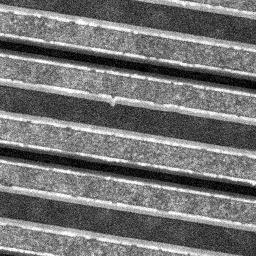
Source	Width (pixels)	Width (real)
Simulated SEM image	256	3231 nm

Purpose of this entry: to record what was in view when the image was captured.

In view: parallel lines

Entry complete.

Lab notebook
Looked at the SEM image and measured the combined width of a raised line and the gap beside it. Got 633 nm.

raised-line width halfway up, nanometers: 366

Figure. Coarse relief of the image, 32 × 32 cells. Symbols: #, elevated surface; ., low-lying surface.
.......................#########
####.........................###
##########......................
################................
######################..........
.....#######################....
............####################
######............##############
#############...........########
###################............#
..#######################.......
........#######################.
..............##################
.....................###########
#..........................#####
########........................
###############.................
#####################...........
...#######################......
..........######################
####............################
##########............##########
################.............###
#######################.........
......#######################...
............####################
...................#############
.........................#######
######..........................
############....................
##################..............
..#######################.......